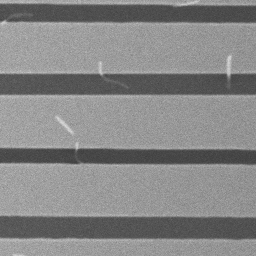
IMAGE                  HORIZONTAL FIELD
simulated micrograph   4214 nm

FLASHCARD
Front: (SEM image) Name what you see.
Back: lines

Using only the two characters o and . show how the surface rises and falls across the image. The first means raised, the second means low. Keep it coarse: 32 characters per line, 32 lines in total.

....................oooooooooooo
................................
................................
oooooooooooooooooooooooooooooooo
oooooooooooooooooooooooooooooooo
oooooooooooooooooooooooooooooooo
oooooooooooooooooooooooooooooooo
oooooooooooooooooooooooooooooooo
oooooooooooooooooooooooooooooooo
................................
................................
................................
oooooooooooooooooooooooooooooooo
oooooooooooooooooooooooooooooooo
oooooooooooooooooooooooooooooooo
oooooooooooooooooooooooooooooooo
oooooooooooooooooooooooooooooooo
oooooooooooooooooooooooooooooooo
.........o...ooooooooooooooooooo
................................
ooooooooo.ooo...................
oooooooooooooooooooooooooooooooo
oooooooooooooooooooooooooooooooo
oooooooooooooooooooooooooooooooo
oooooooooooooooooooooooooooooooo
oooooooooooooooooooooooooooooooo
oooooooooooooooooooooooooooooooo
................................
................................
................................
oooooooooooooooooooooooooooooooo
oooooooooooooooooooooooooooooooo